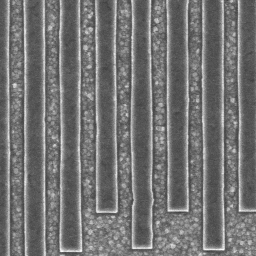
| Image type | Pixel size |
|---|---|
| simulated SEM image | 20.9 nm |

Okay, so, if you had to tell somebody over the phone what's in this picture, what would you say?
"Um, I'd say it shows parallel lines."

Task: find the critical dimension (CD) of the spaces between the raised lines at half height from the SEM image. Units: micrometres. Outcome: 0.311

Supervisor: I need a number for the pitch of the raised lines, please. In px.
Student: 35.7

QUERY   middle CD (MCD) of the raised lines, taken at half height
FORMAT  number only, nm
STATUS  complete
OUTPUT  434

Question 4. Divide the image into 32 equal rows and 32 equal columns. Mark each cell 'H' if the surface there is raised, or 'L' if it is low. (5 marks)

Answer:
HLLHHLLLHHLLHHLLHHHLLHHHLHHHLLHH
HLLHHLLLHHLLHHHLLHHLLHHLLHHHLLHH
HLLHHLLLHHLLHHHLLHHLLHHLLHHHLLHH
HLLHHLLHHHLLHHLLLHHLLHHLLHHHLLHH
HLLHHLLHHHLLHHLLHHHLLHHLLHHHLLHH
HLLHHHLHHHLLHHLLHHHLLHHLLHHHLLHH
HLLHHHLHHHLLHHLLHHHLLHHLLHHHLLHH
HLLHHHLHHHLLHHLLLHHLLHHLLHHHLLHH
HLLHHHLHHHLLHHLLLHHLLHHLLHHHLLHH
HLLHHHLHHHLLHHLLLHHLLHHLLHHHLLHH
HLLHHHLHHHLLHHLLLHHLLHHLLHHHLLHH
HLLHHHLLHHLLHHLLLHHLLHHLLHHHLLHH
HLLHHHLLHHLLHHHLHHHLLHHHLHHHLLHH
HLLHHHLLHHLLHHHLHHHLLHHLLHHHLLHH
HLLHHHLLHHLLHHLLHHHLLHHLLHHHLLHH
HLLHHHLLHHLLHHLLHHHLLHHLLHHHLLHH
HLLHHHLLHHLLHHLLHHHLLHHLLHHHLLHH
HLLHHHLLHHLLHHLLHHHLLHHLLHHHLLHH
HLLHHHLLHHLLHHLLHHHLLHHLLHHHLLHH
HLLHHHLLHHLLHHHLHHHLLHHLLHHHLLHH
HLLHHHLLHHLLHHHLLHHLLHHLLHHHLLHH
HLLHHHLLHHLLHHHLLHHLLHHLLHHHLLHH
HLLHHHLLHHLLHHHLLHHLLHHLLHHHLLHH
HLLHHHLLHHLLHHHLLHHLLHHLLHHHLLHH
HLLHHHLLHHLLHHHLLHHLLHHLLHHHLLHH
HLLHHHLLHHLLHHHLLHHLLHHLLHHHLLHH
HLLHHHLLHHLLLHLLLHHLLLLLLHHHLLLL
HLLHHHLLHHLLLLLLLHHLLLLLLHHHLLLL
HLLHHHLLHHLLLLLLLHHLLLLLLHHHLLLL
HLLHHHLHHHLLLLLLLHHLLLLLLHHHLLLL
HLLHHHLLHHLLLLLLLHHLLLLLLHHHLLLL
HLLHHHLLLLLLLLLLLLLLLLLLLLLLLLLL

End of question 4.